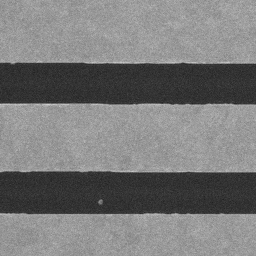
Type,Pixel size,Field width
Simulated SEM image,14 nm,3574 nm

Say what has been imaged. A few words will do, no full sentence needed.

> lines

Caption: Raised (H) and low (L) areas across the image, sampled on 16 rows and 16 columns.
HHHHHHHHHHHHHHHH
HHHHHHHHHHHHHHHH
HHHHHHHHHHHHHHHH
HHHHHHHHHHHHHHHH
LLLLLLLLLLLLLLLL
LLLLLLLLLLLLLLLL
LLLLLLLLLLLLLLLL
HHHHHHHHHHHHHHHH
HHHHHHHHHHHHHHHH
HHHHHHHHHHHHHHHH
HHHHHHHHHHHHHHHH
LLLLLLLLLLLLLLLL
LLLLLLLLLLLLLLLL
HHHHHHHHHHHHHHHH
HHHHHHHHHHHHHHHH
HHHHHHHHHHHHHHHH